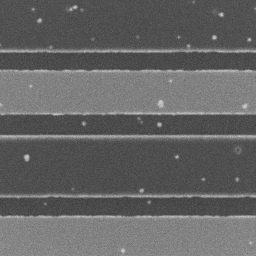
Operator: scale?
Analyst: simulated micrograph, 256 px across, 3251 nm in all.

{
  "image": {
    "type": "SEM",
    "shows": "lines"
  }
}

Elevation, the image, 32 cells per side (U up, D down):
UUUUUUUUUUUUUUUUUUUUUUUUUUUUUUUU
UUUUUUUUUUUUUUUUUUUUUUUUUUUUUUUU
UUUUUUUUUUUUUUUUUUUUUUUUUUUUUUUU
UUUUUUUUUUUUUUUUUUUUUUUUUUUUUUUU
UUUUUUUUUUUUUUUUUUUUUUUUUUUUUUUU
UUUUUUUUUUUUUUUUUUUUUUUUUUUUUUUU
DDDDDDDDDDDDDDDDDDDDDDDDDDDDDDDD
DDDDDDDDDDDDDDDDDDDDDDDDDDDDDDDD
DDDDDDDDDDDDDDDDDDDDDDDDDDDDDDDD
UUUUUUUUUUUUUUUUUUUUUUUUUUUUUUUU
UUUUUUUUUUUUUUUUUUUUUUUUUUUUUUUU
UUUUUUUUUUUUUUUUUUUUUUUUUUUUUUUU
UUUUUUUUUUUUUUUUUUUUUUUUUUUUUUUU
UUUUUUUUUUUUUUUUUUUUUUUUUUUUUUUU
DDDDDDDDDDDDDDDDDDDDDDDDDDDDDDDD
DDDDDDDDDDDDDDDDDDDDDDDDDDDDDDDD
DDDDDDDDDDDDDDDDDDDDDDDDDDDDDDDD
UUUUUUUUUUUUUUUUUUUUUUUUUUUUUUUU
UUUUUUUUUUUUUUUUUUUUUUUUUUUUUUUU
UUUUUUUUUUUUUUUUUUUUUUUUUUUUUUUU
UUUUUUUUUUUUUUUUUUUUUUUUUUUUUUUU
UUUUUUUUUUUUUUUUUUUUUUUUUUUUUUUU
UUUUUUUUUUUUUUUUUUUUUUUUUUUUUUUU
UUUUUUUUUUUUUUUUUUUUUUUUUUUUUUUU
UUUUUUUUUUUUUUUUUUUUUUUUDUUUUUDU
DDDDDDDDDDDDDDDDDDDDDDDDDDDDDDDD
DDDDDDDDDDDDDDDDDDDDDDDDDDDDDDDD
UUUUUUUUUUUUUUUUUUUUUUUUUUUUUUUU
UUUUUUUUUUUUUUUUUUUUUUUUUUUUUUUU
UUUUUUUUUUUUUUUUUUUUUUUUUUUUUUUU
UUUUUUUUUUUUUUUUUUUUUUUUUUUUUUUU
UUUUUUUUUUUUUUUUUUUUUUUUUUUUUUUU